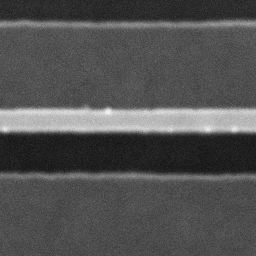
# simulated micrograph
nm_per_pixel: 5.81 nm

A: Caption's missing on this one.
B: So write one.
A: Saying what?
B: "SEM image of lines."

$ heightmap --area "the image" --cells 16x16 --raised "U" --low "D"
DDDDDDDDDDDDDDDD
DUDDDDDDDDDDDDUU
UUUUUUUUUUUUUUUU
UUUUUUUUUUUUUUUU
UUUUUUUUUUUUUUUU
UUUUUUUUUUUUUUUU
UUUUUUUUUUUUUUUU
UUUUUUUUUUUUUUUU
DDDDDDDDDDDDDDDD
DDDDDDDDDDDDDDDD
DDDDDDDDDDDDDDDD
UUUUUUUUUUUUUUUU
UUUUUUUUUUUUUUUU
UUUUUUUUUUUUUUUU
UUUUUUUUUUUUUUUU
UUUUUUUUUUUUUUUU